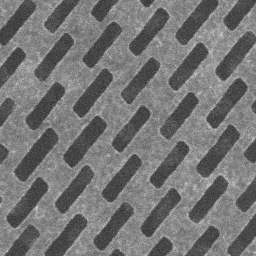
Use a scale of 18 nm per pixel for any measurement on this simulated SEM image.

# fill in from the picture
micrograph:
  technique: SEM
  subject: a regular array of holes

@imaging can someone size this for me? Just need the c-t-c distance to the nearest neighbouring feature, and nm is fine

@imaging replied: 881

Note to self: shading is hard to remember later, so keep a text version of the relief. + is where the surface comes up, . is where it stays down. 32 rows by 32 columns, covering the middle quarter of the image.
++++++..++++++++++++....+++++...
++++++++++.++++++++.....++++....
+++++++++...++++++.....++++.....
++++++++....+++++.....++++......
+++++++.....++++.....+++++.....+
++++++.....++++......+++++....++
+++++......++++.....+++++++..+++
++++......++++.....++++++++++++.
++++.....+++++....++++++++++++..
+++.....+++++++..++++++++++++...
++.....++++++++++++..+++++++....
++.....+++++++++++...+++++++....
+++...+++++++++++.....+++++.....
++++.++...+++++++.....++++.....+
++++++.....+++++.....++++.....++
+++++......++++.....++++.....+++
+++++.....++++.....+++++.....+++
++++......+++.....++++++....++++
+++......+++......+++++++..+++++
++......++++.....+++++++++++..++
+......+++++....++++++++++++...+
+.....+++++++..++++++++++++.....
.....++++++++++++.++++++++.....+
.....+++++++++++...++++++.....++
....+++++++++++.....+++++.....++
+..++.++++++++.....+++++.....+++
++++...+++++++.....++++.....++++
+++.....+++++.....++++.....+++++
+++....+++++.....++++.....++++++
++.....++++.....+++++....+++++++
+.....++++.....+++++++...+++++++
.....+++++.....+++++++++++..++++